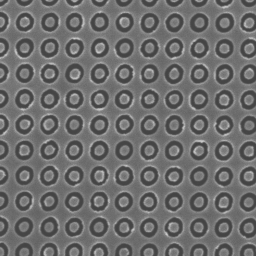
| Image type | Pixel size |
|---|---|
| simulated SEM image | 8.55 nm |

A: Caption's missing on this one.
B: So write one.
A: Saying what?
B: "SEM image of a regular array of ring-shaped grooves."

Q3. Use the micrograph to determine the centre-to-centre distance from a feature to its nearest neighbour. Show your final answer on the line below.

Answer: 212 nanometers